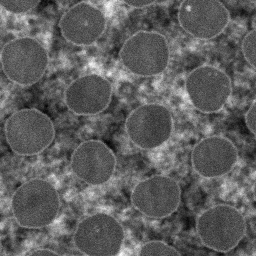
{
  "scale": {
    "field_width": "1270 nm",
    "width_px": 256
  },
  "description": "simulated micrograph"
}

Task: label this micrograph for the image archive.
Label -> a regular array of raised bodies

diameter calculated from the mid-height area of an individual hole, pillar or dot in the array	231	nm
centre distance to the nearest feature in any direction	69.4	pixels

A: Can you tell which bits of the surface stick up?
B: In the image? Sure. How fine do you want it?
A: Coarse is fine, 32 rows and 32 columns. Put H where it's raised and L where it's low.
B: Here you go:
HHHHHLLLLLHLLLLLHHHLLLLHHHHHLLLL
LHHLLLLLHHHHHLLLLLLLLLHHHHHHHLLL
LLLLLLLLHHHHHLLLLLLLLLHHHHHHHLLL
LLLLLLLLHHHHHLLLLLLLLLLHHHHHLLLL
LLLLLLLLHHHHHLLLLHHHLLLLHHHLLLLH
LHHHHLLLLHHHLLLHHHHHHLLLLLLLLLHH
HHHHHHLLLLLLLLLHHHHHHLLLLLLLLLHH
HHHHHHLLLLLLLLLHHHHHHLLLLLLLLLLH
HHHHHHLLLLLLLLLLHHHHHLLLLHHLLLLL
LHHHHLLLLLHHHLLLLLHLLLLHHHHHLLLL
LLHHLLLLLHHHHHLLLLLLLLLHHHHHHLLL
LLLLLLLLHHHHHHLLLLLLLLLHHHHHHLLL
LLLLLLLLHHHHHHLLLLLLLLLLHHHHLLLL
LLLLLLLLLHHHHLLLLHHHHLLLLHHHLLLH
LHHHHHLLLLLLLLLLHHHHHLLLLLLLLLLH
LHHHHHHLLLLLLLLLHHHHHHLLLLLLLLLH
LHHHHHHLLLLLLLLLHHHHHLLLLLLLLLLL
LHHHHHHLLLLHLLLLHHHHHLLLLHHHHLLL
LHHHHHLLLLHHHHLLLLHLLLLLHHHHHLLL
LLLLLLLLLHHHHHLLLLLLLLLLHHHHHHLL
LLLLLLLLLHHHHHLLLLLLLLLLHHHHHLLL
LLLLLLLLLHHHHHLLLLLLLLLLLHHHHLLL
LLLLHHLLLLHHHHLLLLHHHHLLLLLLLLLL
LLHHHHHLLLLLLLLLLHHHHHLLLLLLLLLL
LLHHHHHLLLLLLLLLHHHHHHHLLLLLLLLL
LHHHHHHLLLLLLLLLLHHHHHLLLLLLLLLL
LLHHHHHLLLLLLLLLLLHHHHLLLHHHHHLL
LLHHHHHLLLHHHHHLLLLLLLLLLHHHHHHL
LLLLHLLLLLHHHHHLLLLLLLLLLHHHHHHL
LLLLLLLLLHHHHHHHLLLLLLLLLHHHHHLL
LLLLLLLLLHHHHHHLLLHHHLLLLHHHHHLL
LLLLHHHLLLHHHHHLLHHHHHLLLLLLLLLL